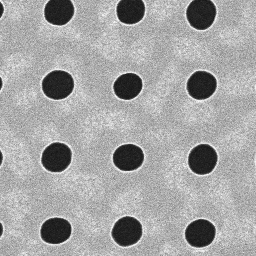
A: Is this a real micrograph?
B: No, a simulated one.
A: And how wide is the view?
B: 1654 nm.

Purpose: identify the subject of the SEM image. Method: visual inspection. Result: a regular array of holes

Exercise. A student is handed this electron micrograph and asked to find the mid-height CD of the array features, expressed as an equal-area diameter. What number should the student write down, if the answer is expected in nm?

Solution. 186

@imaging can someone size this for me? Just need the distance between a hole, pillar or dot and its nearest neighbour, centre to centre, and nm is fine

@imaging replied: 461